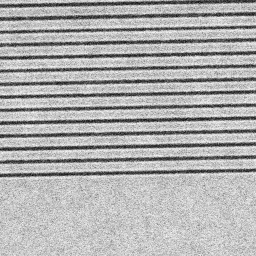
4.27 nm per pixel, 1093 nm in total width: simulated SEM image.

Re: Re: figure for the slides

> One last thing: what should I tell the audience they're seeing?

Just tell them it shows parallel lines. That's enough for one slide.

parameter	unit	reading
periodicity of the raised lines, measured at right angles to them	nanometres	55.5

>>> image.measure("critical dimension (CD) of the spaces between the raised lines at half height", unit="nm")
19.7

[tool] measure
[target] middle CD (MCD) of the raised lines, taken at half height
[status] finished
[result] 34.6 nanometres